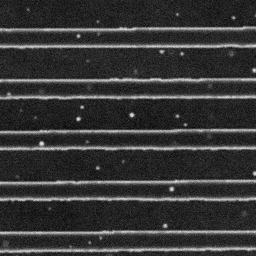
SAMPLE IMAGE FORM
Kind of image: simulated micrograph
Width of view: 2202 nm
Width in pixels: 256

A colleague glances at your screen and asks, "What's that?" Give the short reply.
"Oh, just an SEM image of lines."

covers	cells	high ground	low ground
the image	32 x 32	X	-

--------------------------------
--------------------------------
--------------------------------
------------------------------XX
XXXXXXXXXXXXXXXXXXXXXXXXXXXXXXXX
XXXXXXXXXXXXXXXXXXXXXXXXXXXXXXXX
--------------------------------
--------------------------------
--------------------------------
--------------------------------
XXXXXXXXXXXXXXXXXXXXXXXXXXXXXXXX
XXXXXXXXXXXXXXXXXXXXXXXXXXXXXXXX
--------------------------------
--------------------------------
--------------------------------
--------------------------------
XXXXXXXXXXXXXXXXXXXXXXXXXXXXXXXX
XXXXXXXXXXXXXXXXXXXXXXXXXXXXXXXX
XXXXXXXXXXXXXXXXXXXXXXXXXXXXXXXX
--------------------------------
--------------------------------
--------------------------------
--------------------------------
XXXXXXXXXXXXXXXXXXXXXXXXXXXXXXXX
XXXXXXXXXXXXXXXXXXXXXXXXXXXXXXXX
--------------------------------
--------------------------------
--------------------------------
--------------------------------
XXXXXXXXXXXXXXXXXXXXXXXXXXXXXXXX
XXXXXXXXXXXXXXXXXXXXXXXXXXXXXXXX
--------------------------------